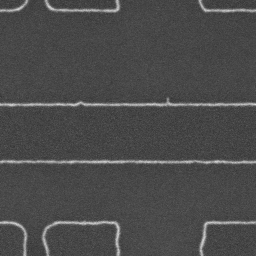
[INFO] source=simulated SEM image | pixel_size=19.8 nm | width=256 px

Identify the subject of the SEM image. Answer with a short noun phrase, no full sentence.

one or a few lines or trenches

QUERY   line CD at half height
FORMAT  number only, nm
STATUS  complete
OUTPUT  1140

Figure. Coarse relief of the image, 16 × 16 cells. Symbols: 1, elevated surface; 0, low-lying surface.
1001111000000111
0000000000000000
0000000000000000
0000000000000000
0000000000000000
0000000000000000
0000000000000000
1111111111111111
1111111111111111
1111111111111111
0000000000000000
0000000000000000
0000000000000000
0000000000000000
1001111000000111
1101111000000111